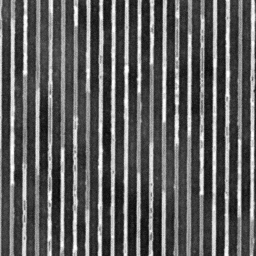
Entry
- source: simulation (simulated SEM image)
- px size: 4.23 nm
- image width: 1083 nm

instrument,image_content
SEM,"parallel lines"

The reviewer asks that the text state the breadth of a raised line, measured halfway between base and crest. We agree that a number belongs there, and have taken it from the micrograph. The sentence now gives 12.2 nanometres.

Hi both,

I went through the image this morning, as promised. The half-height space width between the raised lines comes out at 39.7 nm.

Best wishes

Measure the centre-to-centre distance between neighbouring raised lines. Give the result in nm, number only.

53.5